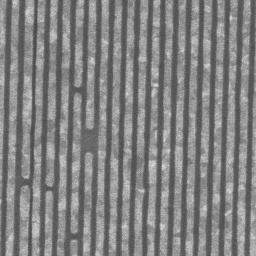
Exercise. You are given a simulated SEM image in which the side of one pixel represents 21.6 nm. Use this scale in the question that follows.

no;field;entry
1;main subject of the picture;parallel lines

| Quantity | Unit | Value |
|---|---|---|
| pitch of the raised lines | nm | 277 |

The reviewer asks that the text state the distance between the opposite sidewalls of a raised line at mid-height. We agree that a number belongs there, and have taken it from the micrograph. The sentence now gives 167 nm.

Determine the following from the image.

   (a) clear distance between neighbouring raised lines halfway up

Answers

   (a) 111 nm